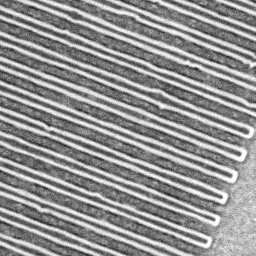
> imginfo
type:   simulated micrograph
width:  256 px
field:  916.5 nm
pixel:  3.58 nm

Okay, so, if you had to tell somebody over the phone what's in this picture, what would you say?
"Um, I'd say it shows parallel lines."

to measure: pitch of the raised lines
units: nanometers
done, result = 84.1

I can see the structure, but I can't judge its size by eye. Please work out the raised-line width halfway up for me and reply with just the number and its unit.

32.2 nm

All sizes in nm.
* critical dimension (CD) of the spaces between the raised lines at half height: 53.6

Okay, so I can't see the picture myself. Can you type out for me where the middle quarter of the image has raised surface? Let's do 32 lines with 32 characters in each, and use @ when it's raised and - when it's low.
@@@@@-----------@@@@@@----------
---@@@@@@----------@@@@@--------
-----@@@@@@----------@@@@@@-----
--------@@@@@@----------@@@@@@--
----------@@@@@@@---------@@@@@@
@@----------@@@@@@@----------@@@
@@@@@@---------@@@@@@@@---------
-@@@@@@@----------@@@@@@@-------
---@@@@@@@----------@@@@@@@-----
-------@@@@@@----------@@@@@@@--
---------@@@@@@@--------@@@@@@@@
@@----------@@@@@@@---------@@@@
@@@@----------@@@@@@@----------@
-@@@@@----------@@@@@@@---------
----@@@@@----------@@@@@@@------
------@@@@@@----------@@@@@@@---
---------@@@@@@----------@@@@@@-
@----------@@@@@@-----------@@@@
@@@@----------@@@@@@----------@@
@@@@@@-----------@@@@@@---------
---@@@@@@----------@@@@@@@------
-----@@@@@@----------@@@@@@@----
--------@@@@@@----------@@@@@@@-
----------@@@@@@@----------@@@@@
@@@----------@@@@@@----------@@@
@@@@@-----------@@@@@@----------
-@@@@@@@-----------@@@@@--------
----@@@@@@-----------@@@@@@@----
-------@@@@@@----------@@@@@@@--
----------@@@@@@----------@@@@@@
@@-----------@@@@@@----------@@@
@@@@@----------@@@@@@----------@